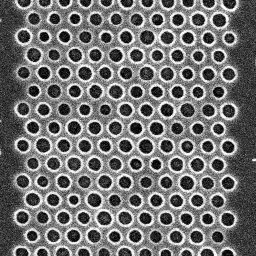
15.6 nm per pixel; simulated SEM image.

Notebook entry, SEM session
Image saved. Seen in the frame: a regular array of holes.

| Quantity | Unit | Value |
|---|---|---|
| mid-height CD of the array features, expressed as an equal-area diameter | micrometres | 0.197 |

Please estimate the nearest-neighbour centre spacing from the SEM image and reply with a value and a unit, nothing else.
317 nm